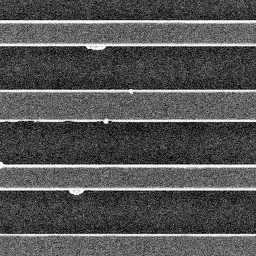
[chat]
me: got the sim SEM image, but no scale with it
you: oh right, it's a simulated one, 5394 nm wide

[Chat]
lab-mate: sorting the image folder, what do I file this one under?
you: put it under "lines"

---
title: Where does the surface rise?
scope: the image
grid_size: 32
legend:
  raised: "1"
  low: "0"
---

00000000000000000000000000000000
00000000000000000000000000000000
00000000000000000000000000000000
11111111111111111111111111111111
11111111111111111111111111111111
11111111111111111111111111111111
00000000000000000000000000000000
00000000000000000000000000000000
00000000000000000000000000000000
00000000000000000000000000000000
00000000000000000000000000000000
11111111111111111111111111111111
11111111111111111111111111111111
11111111111111111111111111111111
11111111111111111111111111111111
00000000000000000000000000000000
00000000000000000000000000000000
00000000000000000000000000000000
00000000000000000000000000000000
00000000000000000000000000000000
10000000000000000000000000000000
11111111111111111111111111111111
11111111111111111111111111111111
11111111111111111111111111111111
00000000000000000000000000000000
00000000000000000000000000000000
00000000000000000000000000000000
00000000000000000000000000000000
00000000000000000000000000000000
11111111111111111111111111111111
11111111111111111111111111111111
11111111111111111111111111111111